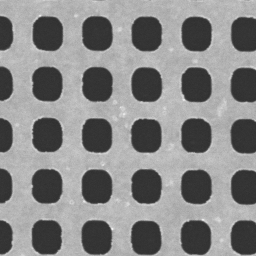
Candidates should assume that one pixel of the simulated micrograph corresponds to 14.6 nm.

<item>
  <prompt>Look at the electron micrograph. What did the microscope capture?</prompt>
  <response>a regular array of holes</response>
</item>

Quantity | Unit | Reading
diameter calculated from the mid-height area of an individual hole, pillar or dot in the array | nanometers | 493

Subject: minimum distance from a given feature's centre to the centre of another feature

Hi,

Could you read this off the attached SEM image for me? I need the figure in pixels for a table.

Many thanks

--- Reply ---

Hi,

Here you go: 49.6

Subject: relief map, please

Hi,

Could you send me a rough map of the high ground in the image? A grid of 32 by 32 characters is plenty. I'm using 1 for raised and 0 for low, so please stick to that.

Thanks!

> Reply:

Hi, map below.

11111111111111111111111111111111
11111111111111111111111111111111
01111001111001111000111000111000
00110000110000110000111000111000
00110000110000110000111000111000
01110000110000111000111000111000
11111111111111111111111111111111
11111111111111111111111111111111
01111001111001111101111101111101
01110000110000111000111000111000
00110000110000110000111000111000
01110000110000111000111000111000
01111001111001111001111000111100
11111111111111111111111111111111
11111111111111111111111111111111
01110001111000111000111000111000
00110000110000110000111000111000
00110000110000110000111000111000
01110001111000111000111000111000
11111111111111111111111111111111
11111111111111111111111111111111
01111001111001111000111000111100
01110000110000110000111000111000
00110000110000110000111000111000
01110000110000111000111000111000
11111111111111111111111101111100
11111111111111111111111111111111
11111011111111111111111111111111
01110000110000111000111000111000
00110000110000110000111000111000
00110000110000110000111000111000
01111001111001111000111000111000